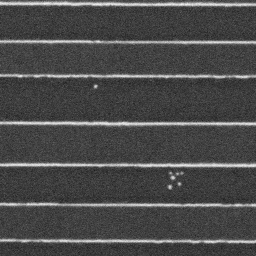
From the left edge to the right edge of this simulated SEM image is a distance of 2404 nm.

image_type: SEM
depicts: lines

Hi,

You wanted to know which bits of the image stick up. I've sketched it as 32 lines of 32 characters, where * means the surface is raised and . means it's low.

...*****************************
................................
................................
................................
................................
********************************
********************************
********************************
********************************
......****.*********************
................................
................................
................................
................................
................................
****************.***********.*..
********************************
********************************
********************************
********************************
********************************
................................
................................
................................
................................
......*.........................
********************************
********************************
********************************
********************************
................................
................................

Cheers